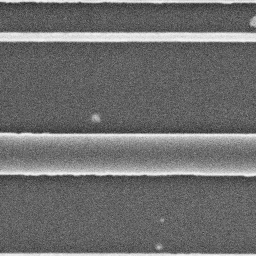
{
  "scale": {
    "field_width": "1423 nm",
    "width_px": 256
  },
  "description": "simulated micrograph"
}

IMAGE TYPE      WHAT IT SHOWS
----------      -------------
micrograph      lines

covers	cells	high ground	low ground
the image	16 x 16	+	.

................
................
................
................
................
................
................
................
++++++++++++++++
++++++++++++++++
++++++++++++++++
................
................
................
................
................